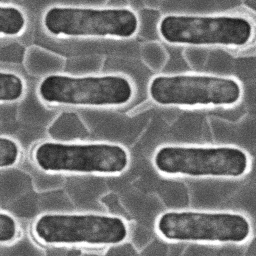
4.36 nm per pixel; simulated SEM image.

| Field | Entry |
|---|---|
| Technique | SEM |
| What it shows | a regular array of holes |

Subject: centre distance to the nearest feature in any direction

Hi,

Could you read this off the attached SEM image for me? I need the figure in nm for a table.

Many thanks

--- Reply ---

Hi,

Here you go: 290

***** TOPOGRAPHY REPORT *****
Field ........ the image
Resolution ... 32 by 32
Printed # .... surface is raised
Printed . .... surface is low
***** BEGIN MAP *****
################################
..####...........###############
...###...........###...........#
...###...........###...........#
##########...##.####...........#
########################......##
################################
################################
################################
..####..###..#########....######
...##...........###...........##
...##...........###...........##
..####..........###...........##
################################
################################
################################
################################
.###############################
..###..........#####.....##..###
..##............###............#
.####...........####...........#
##########.#..#######..........#
################################
################################
################################
################################
#####################.#.########
..###..........#####...........#
..##............####...........#
..###...........#####..........#
################################
################################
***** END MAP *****